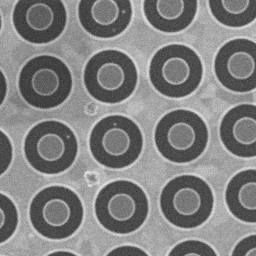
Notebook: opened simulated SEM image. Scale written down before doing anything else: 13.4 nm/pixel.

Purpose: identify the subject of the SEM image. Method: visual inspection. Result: an array of small figures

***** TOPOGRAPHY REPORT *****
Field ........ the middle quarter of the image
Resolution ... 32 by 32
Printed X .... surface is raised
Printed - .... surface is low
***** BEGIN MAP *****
-XXXX-----XXXX----XXX----XXXXXX-
--XXX----XXXXX----XXX----XXXXXX-
--XXX---XXXXXXX----XX----XXXXXX-
--XXX---XXXXXXX----XX----XXXXXX-
--XXX----XXXXXX---XXXX----XXXX--
--XXX----XXXXX----XXXX----------
--XXX-------------XXXXX---------
--XXXX-----------XXXXXXX--------
-XXXXXX---------XXXXXXXXXX----XX
XXXXXXXXX-----XXXXXXXXXXXXXXXXXX
XXXXXXXXXXXXXXXXXXXXXXXXXXXXXXXX
XXXXXXXXXXXXXXXXXXXXXXXXXXX-----
XXXXXXXXXXXX--XXXXXXXXXXX-------
XXXXXXXXX--------XXXXXXX--------
XXXXXXXX----------XXXXX---------
-XXXXXX------------XXXX----XXXX-
--XXXXX-----XX-----XXXX----XXXXX
---XXX----XXXXXX----XX----XXXXXX
---XXX----XXXXXX----XX----XXXXXX
----XX----XXXXXX----XX----XXXXXX
----XX----XXXXXX----XXX----XXXXX
----XX----XXXXX-----XXX---------
---XXXX-----XX-----XXXXX--------
---XXXX------------XXXXXX-------
---XXXXX----------XXXXXXXX------
--XXXXXXXX-------XXXXXXXXXXXXXXX
-XXXXXXXXXXXX-XXXXXXXXXXXXXXXXXX
XXXXXXXXXXXXXXXXXXXXXXXXXXXXX---
XXXXXXXXXXXXXXXXXXXXXXXXXXX-----
XXXXXXXXXXX-------XXXXXXXX------
XXXXXXXXXX---------XXXXXX-------
--XXXXXXX-----------XXXX-----XXX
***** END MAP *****